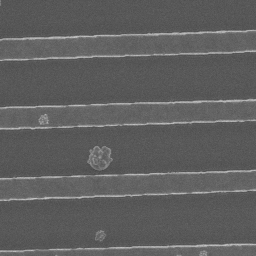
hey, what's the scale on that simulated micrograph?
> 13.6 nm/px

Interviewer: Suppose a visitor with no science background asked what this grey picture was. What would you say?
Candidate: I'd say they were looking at lines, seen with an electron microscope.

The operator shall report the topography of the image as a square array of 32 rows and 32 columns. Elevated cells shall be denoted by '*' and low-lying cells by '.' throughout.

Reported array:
................................
................................
................................
................................
............********************
********************************
*******************************.
................................
................................
................................
................................
................................
................................
********************************
********************************
******************..............
................................
................................
................................
................................
................................
..........................******
********************************
********************************
***************.................
................................
................................
................................
................................
................................
................................
********************************